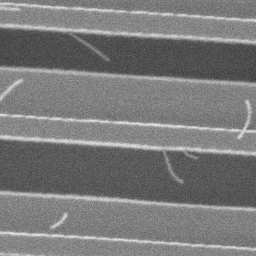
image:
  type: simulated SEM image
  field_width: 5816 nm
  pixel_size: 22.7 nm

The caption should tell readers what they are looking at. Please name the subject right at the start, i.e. lines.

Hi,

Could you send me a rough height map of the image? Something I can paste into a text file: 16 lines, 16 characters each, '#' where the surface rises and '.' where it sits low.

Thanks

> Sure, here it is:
################
################
..............##
................
###.............
################
################
################
################
..............##
................
................
######..........
################
################
################